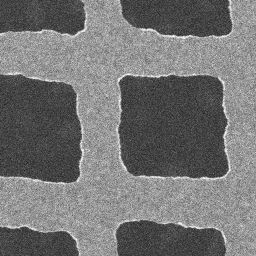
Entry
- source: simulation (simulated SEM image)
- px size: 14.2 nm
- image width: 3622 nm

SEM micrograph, holes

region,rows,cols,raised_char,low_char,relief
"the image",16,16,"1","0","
0000011100000011
0000011100000001
1111111111111111
1111111111111111
1111111111111111
0000011000000011
0000011100000011
0000011000000011
0000011000000011
0000011100000011
0000011100000011
1111111111111111
1111111111111111
1111111111111111
0000111000000011
0000011000000011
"